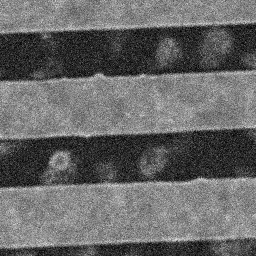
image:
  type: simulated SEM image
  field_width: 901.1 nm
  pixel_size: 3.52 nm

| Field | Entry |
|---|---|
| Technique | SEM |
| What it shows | one or a few lines or trenches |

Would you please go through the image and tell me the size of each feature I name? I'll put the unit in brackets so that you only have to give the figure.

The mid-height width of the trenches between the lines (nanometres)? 176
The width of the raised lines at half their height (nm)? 201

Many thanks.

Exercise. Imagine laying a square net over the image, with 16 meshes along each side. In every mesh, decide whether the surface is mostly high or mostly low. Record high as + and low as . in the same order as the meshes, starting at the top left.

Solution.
++++++++++++++++
+++++++++++++...
................
................
...............+
++++++++++++++++
++++++++++++++++
++++++++++++++++
+++.............
................
................
........++++++++
++++++++++++++++
++++++++++++++++
++++++++++++++++
................